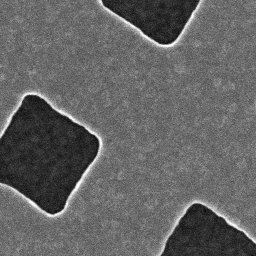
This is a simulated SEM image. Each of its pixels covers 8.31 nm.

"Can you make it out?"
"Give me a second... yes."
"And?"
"holes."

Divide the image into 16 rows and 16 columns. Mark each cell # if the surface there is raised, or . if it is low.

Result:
#######.....####
########....####
##########.#####
################
################
################
#..#############
#....###########
......##########
......##########
......##########
.....###########
##..############
###########...##
###########....#
##########......